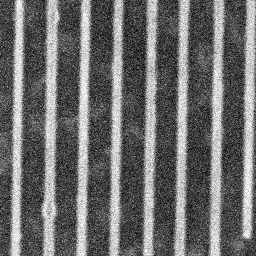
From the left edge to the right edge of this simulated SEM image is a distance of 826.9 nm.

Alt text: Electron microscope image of parallel lines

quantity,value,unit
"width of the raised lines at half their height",0.0222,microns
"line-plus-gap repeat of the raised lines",107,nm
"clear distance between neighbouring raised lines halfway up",26.7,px